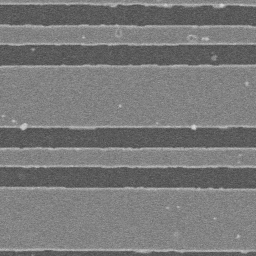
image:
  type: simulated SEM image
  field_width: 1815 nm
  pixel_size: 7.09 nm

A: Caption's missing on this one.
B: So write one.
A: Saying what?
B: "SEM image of lines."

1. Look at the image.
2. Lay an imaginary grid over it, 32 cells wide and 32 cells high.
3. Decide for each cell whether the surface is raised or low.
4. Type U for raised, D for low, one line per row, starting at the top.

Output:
DDDDDDDDUDDUUUUUUUUUUUUUUUUUUUUU
DDDDDDDDDDDDDDDDDDDDDDDDDDDDDDDD
DDDDDDDDDDDDDDDDDDDDDDDDDDDDDDDD
UUUUUUUUUUUUUUUUUUUUUUUUUUUUUUUU
UUUUUUUUUUUUUUUUUUUUUUUUUUUUUUUU
UUUUUUUUUUUUUUUUUUUUUUUUUUUUUUUU
DDDDDDDDDDDDDDDDDDDDDDDDDDDDDDDD
DDDDDDDDDDDDDDDDDDDDDDDDDDDDDDDD
UUUUUUUUUUUUUUUUUUUUUUUUUUUUUUUU
UUUUUUUUUUUUUUUUUUUUUUUUUUUUUUUU
UUUUUUUUUUUUUUUUUUUUUUUUUUUUUUUU
UUUUUUUUUUUUUUUUUUUUUUUUUUUUUUUU
UUUUUUUUUUUUUUUUUUUUUUUUUUUUUUUU
UUUUUUUUUUUUUUUUUUUUUUUUUUUUUUUU
UUUUUUUUUUUUUUUUUUUUUUUUUUUUUUUU
UUUUUUUUUUUUUUUUUUUUUUUUUUUUUUUU
DDDDDDDDDDDDDDDDDDDDDDDDDDDDDDDD
DDDDDDDDDDDDDDDDDDDDDDDDDDDDDDDD
DDDDUUDDDDDDDDDDDDDDDDDDDDDDDDDD
UUUUUUUUUUUUUUUUUUUUUUUUUUUUUUUU
UUUUUUUUUUUUUUUUUUUUUUUUUUUUUUUU
DDDDDDDDDDDDDDDDDDDDDDDDDDDDDDDD
DDDDDDDDDDDDDDDDDDDDDDDDDDDDDDDD
UUUUUUUUUDDDDDDUUUDDDDDDDDDDDDDD
UUUUUUUUUUUUUUUUUUUUUUUUUUUUUUUU
UUUUUUUUUUUUUUUUUUUUUUUUUUUUUUUU
UUUUUUUUUUUUUUUUUUUUUUUUUUUUUUUU
UUUUUUUUUUUUUUUUUUUUUUUUUUUUUUUU
UUUUUUUUUUUUUUUUUUUUUUUUUUUUUUUU
UUUUUUUUUUUUUUUUUUUUUUUUUUUUUUUU
UUUUUUUUUUUUUUUUUUUUUUUUUUUUUUUU
DDDDDDDDDDDDDDDDDUDDDDDDDDDDDDUD